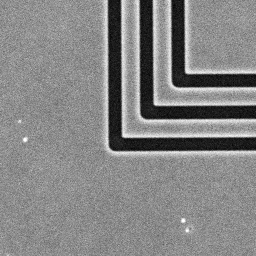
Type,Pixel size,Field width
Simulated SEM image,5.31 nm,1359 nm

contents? groups of lines, slits or small figures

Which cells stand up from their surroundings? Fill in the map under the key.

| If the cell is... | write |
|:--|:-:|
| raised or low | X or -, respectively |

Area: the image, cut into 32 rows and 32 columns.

XXXXXXXXXXXXX--XX--XX--XXXXXXXXX
XXXXXXXXXXXXX--XX--XX--XXXXXXXXX
XXXXXXXXXXXXX--XX--XX--XXXXXXXXX
XXXXXXXXXXXXX--XX--XX--XXXXXXXXX
XXXXXXXXXXXXX--XX--XX--XXXXXXXXX
XXXXXXXXXXXXX--XX--XX--XXXXXXXXX
XXXXXXXXXXXXX--XX--XX--XXXXXXXXX
XXXXXXXXXXXXX--XX--XX--XXXXXXXXX
XXXXXXXXXXXXX--XX--XX--XXXXXXXXX
XXXXXXXXXXXXX--XX--XX-----------
XXXXXXXXXXXXX--XX--XXX----------
XXXXXXXXXXXXX--XX--XXXXXXXXXXXXX
XXXXXXXXXXXXX--XX--XXXXXXXXXXXXX
XXXXXXXXXXXXX--XX---------------
XXXXXXXXXXXXX--XXX--------------
XXXXXXXXXXXXX--XXXXXXXXXXXXXXXXX
XXXXXXXXXXXXX--XXXXXXXXXXXXXXXXX
XXXXXXXXXXXXX-------------------
XXXXXXXXXXXXXX------------------
XXXXXXXXXXXXXXXXXXXXXXXXXXXXXXXX
XXXXXXXXXXXXXXXXXXXXXXXXXXXXXXXX
XXXXXXXXXXXXXXXXXXXXXXXXXXXXXXXX
XXXXXXXXXXXXXXXXXXXXXXXXXXXXXXXX
XXXXXXXXXXXXXXXXXXXXXXXXXXXXXXXX
XXXXXXXXXXXXXXXXXXXXXXXXXXXXXXXX
XXXXXXXXXXXXXXXXXXXXXXXXXXXXXXXX
XXXXXXXXXXXXXXXXXXXXXXXXXXXXXXXX
XXXXXXXXXXXXXXXXXXXXXXXXXXXXXXXX
XXXXXXXXXXXXXXXXXXXXXXXXXXXXXXXX
XXXXXXXXXXXXXXXXXXXXXXXXXXXXXXXX
XXXXXXXXXXXXXXXXXXXXXXXXXXXXXXXX
XXXXXXXXXXXXXXXXXXXXXXXXXXXXXXXX